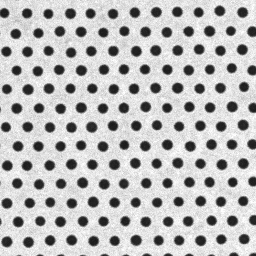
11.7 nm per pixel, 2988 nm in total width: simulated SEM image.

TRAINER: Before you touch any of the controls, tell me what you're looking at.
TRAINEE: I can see a regular array of holes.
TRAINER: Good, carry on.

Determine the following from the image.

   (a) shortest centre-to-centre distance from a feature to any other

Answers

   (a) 242 nm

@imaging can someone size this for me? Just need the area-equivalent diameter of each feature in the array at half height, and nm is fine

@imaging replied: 128